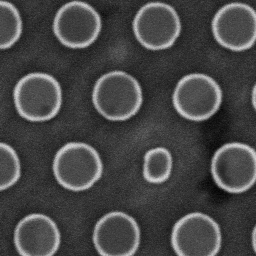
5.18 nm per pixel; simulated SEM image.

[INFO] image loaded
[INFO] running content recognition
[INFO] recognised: raised bodies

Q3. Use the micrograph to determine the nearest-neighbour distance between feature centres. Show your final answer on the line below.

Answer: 413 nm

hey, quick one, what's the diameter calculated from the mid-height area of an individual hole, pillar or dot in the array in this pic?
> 234 nm